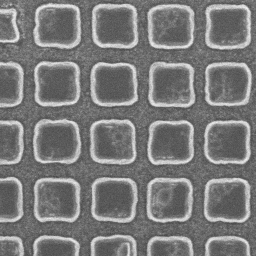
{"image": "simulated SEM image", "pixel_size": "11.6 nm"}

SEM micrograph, a regular array of raised bodies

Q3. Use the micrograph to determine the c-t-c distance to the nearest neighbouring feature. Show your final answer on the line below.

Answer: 56.7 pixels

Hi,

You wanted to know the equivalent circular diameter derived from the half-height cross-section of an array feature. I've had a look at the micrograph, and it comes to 524 nanometres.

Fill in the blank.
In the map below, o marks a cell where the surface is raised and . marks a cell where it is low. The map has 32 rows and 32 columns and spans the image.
................................
oo...ooooo..ooooo..ooooo..ooooo.
oo...ooooo..ooooo..ooooo..ooooo.
oo...ooooo..ooooo..ooooo..ooooo.
oo...ooooo..ooooo..ooooo..ooooo.
.....oooo...ooooo..ooooo..ooooo.
................................
................................
oo...ooooo..oooo...ooooo..ooooo.
ooo..ooooo..ooooo..ooooo..ooooo.
ooo..ooooo..ooooo..ooooo..ooooo.
ooo..ooooo..ooooo..ooooo..ooooo.
oo...oooo...ooooo..ooooo..ooooo.
................................
................................
oo...oooo...oooo....oooo...oooo.
ooo..ooooo..ooooo..ooooo..ooooo.
ooo.oooooo..ooooo..ooooo..ooooo.
ooo.oooooo..ooooo..ooooo..ooooo.
oo...ooooo..ooooo..ooooo..ooooo.
................................
................................
.o...........ooo.............o..
ooo..ooooo..ooooo..ooooo..ooooo.
ooo..ooooo..ooooo..ooooo..ooooo.
ooo..ooooo..ooooo..ooooo..ooooo.
ooo..ooooo..ooooo..ooooo..ooooo.
..............oo....o.......oo..
................................
................................
ooo.oooooo..ooooo..ooooo..ooooo.
ooo.oooooo..ooooo..ooooo..ooooo.